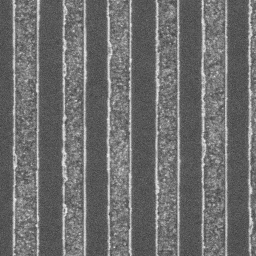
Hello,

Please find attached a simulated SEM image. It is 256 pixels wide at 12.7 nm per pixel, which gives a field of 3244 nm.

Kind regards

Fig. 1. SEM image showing lines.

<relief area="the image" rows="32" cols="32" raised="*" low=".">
**...***...***..****..***...***.
**...***...***..****..***...***.
**...***...***..****..***...***.
**...***...***..****..***...***.
**...***...***..****..***...***.
**...***...***..****..***...***.
**...***...***..****..***...***.
**...***...***..****..***...***.
**...***...***..****..***...***.
**...***...***..****..***...***.
**...***...***..****..****..***.
**...***...***..****..***...***.
**...***...***..****..***...***.
**...***...***..****..***...***.
**...***...***..****..***...***.
**...***...***..****..***...***.
**...***...***..****..***...***.
**...***...***..****..***...***.
**...***...***..****..****..***.
**...***...***..****..***...***.
**...***...***..****..***...***.
**...***...***..****..***...***.
**...***...***..****..***...***.
**...***...***..****..***...***.
**...***...***..****..***...***.
**...***...***..****..***...***.
**...***...***..****..***...***.
**...***...***..****..***...***.
**...***...***..****..***...***.
**...***...***..****..***...***.
**...***...***..****..***...***.
**...***...***..****..***...***.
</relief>